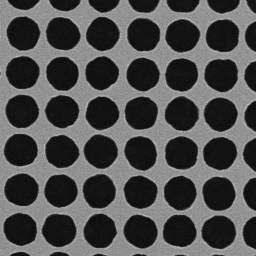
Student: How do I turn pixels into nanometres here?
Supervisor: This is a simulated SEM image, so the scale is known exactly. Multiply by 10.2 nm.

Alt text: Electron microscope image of a regular array of holes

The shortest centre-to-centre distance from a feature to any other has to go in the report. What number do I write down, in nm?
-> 398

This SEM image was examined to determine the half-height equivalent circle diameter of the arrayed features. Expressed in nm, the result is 342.